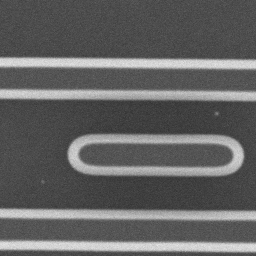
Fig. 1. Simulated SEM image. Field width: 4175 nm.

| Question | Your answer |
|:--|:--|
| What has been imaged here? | groups of lines, slits or small figures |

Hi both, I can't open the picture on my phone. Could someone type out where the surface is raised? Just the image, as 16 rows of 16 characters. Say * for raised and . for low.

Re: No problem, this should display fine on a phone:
................
................
................
................
****************
****************
................
................
................
.....**********.
.....*********..
................
................
****************
****************
................